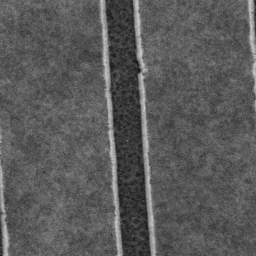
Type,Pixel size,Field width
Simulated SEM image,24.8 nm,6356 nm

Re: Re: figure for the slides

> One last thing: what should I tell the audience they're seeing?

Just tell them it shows one or a few lines or trenches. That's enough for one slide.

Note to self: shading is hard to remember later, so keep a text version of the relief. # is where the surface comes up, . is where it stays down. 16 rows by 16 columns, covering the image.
######...#######
#######..#######
#######..#######
#######..#######
#######..#######
#######..#######
#######..#######
#######..#######
#######..#######
#######..#######
#######..#######
#######..#######
#######..#######
#######..#######
#######..#######
#######...######